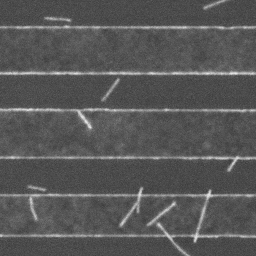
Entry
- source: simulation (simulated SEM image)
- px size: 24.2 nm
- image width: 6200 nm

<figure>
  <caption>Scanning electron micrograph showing lines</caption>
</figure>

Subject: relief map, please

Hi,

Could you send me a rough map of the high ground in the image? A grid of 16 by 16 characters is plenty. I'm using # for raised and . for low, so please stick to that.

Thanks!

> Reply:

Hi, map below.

................
................
################
################
################
................
................
################
################
################
................
................
################
################
################
................